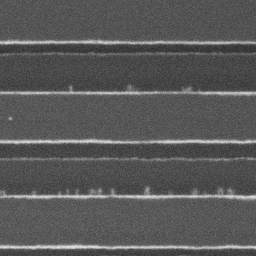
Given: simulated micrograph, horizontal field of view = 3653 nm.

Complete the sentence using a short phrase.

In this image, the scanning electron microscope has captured lines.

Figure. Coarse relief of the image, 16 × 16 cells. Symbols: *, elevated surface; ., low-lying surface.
****************
****************
****************
................
................
................
****************
****************
****************
................
................
................
****************
****************
****************
................